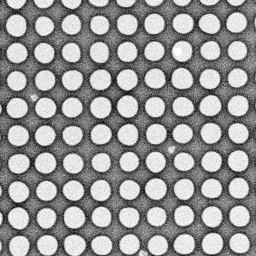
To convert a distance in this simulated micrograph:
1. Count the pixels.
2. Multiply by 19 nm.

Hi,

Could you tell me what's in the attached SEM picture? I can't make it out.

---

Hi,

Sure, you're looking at an array of small figures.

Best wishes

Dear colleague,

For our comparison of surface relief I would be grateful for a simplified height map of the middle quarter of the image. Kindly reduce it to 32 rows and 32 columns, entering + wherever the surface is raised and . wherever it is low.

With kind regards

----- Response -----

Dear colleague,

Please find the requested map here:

................................
......................++....+++.
++++...++++...++++...++++..+++++
+++++..+++++.+++++..+++++..+++++
++++...+++++.+++++...++++..+++++
++++...++++...++++...++++...++++
................................
................................
........++....+++............+..
++++...++++...++++...++++...++++
++++...+++++.+++++..+++++..+++++
++++...+++++..++++...++++..+++++
++++...++++...++++...+++....+++.
................................
................................
........++.....++.....++....+++.
++++...++++...++++...++++...++++
++++...+++++..++++...++++..+++++
++++...+++++..++++...++++...++++
++++....+++...++++....++.....++.
................................
................................
.........+.....+++....++.....++.
++++...++++...++++...++++...++++
+++++..++++...+++++..++++...++++
+++++..++++...++++...++++...++++
.+++....+++....++.....++.....++.
................................
................................
.++.....+++....+++...++++...++++
+++++..++++...+++++.+++++...++++
+++++..++++...+++++.+++++...++++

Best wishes